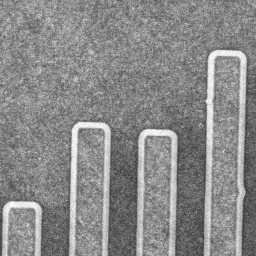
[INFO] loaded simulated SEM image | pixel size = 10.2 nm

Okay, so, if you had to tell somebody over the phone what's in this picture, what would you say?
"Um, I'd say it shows one or a few lines or trenches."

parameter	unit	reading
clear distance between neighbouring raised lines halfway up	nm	354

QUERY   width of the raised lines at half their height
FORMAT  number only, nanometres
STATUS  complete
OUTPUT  336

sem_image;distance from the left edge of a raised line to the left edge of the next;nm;688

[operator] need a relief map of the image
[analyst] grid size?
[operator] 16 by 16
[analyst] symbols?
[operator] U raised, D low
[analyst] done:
DDDDDDDDDDDDDDDD
DDDDDDDDDDDDDDDD
DDDDDDDDDDDDDDDD
DDDDDDDDDDDDDUUD
DDDDDDDDDDDDDUUD
DDDDDDDDDDDDDUUD
DDDDDDDDDDDDDUUD
DDDDDDDDDDDDDUUD
DDDDDUUDDUUDDUUD
DDDDDUUDDUUDDUUD
DDDDDUUDDUUDDUUD
DDDDDUUDDUUDDUUD
DDDDDUUDDUUDDUUD
UUDDDUUDDUUDDUUD
UUDDDUUDDUUDDUUD
UUDDDUUDDUUDDUUD